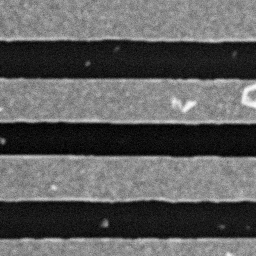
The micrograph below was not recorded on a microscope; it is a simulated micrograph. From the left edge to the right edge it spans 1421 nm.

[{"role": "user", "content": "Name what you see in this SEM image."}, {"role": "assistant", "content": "lines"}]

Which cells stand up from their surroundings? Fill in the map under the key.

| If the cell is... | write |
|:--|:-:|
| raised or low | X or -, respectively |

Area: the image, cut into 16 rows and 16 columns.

XXXXXXXXXXXXXXXX
XXXXXXXXXXXXXXXX
X--------XXXXXXX
----------------
----------------
XXXXXXXXXXXXXXXX
XXXXXXXXXXXXXXXX
XXXXXXXXXXXXXXXX
----------------
----------------
XXXXXXXXXXXXXXXX
XXXXXXXXXXXXXXXX
X----XXX--XXXXXX
----------------
----------------
XXXXXXXXXXXXXXXX